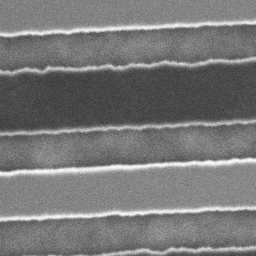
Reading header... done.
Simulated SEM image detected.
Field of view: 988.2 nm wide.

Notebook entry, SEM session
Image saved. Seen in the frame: lines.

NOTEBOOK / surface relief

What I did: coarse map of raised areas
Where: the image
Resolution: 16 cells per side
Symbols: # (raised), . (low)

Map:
################
###############.
................
................
################
################
################
################
................
................
......##########
################
################
######..........
................
..............##